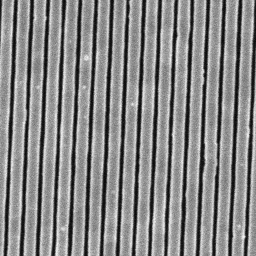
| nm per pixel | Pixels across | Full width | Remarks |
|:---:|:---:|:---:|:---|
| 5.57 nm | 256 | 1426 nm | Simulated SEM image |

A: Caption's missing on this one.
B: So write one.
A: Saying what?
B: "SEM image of parallel lines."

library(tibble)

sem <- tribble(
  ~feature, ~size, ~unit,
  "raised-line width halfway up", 61.9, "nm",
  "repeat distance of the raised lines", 89.1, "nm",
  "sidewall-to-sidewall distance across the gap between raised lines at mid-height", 27.8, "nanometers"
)